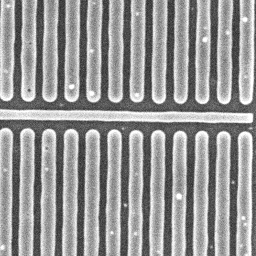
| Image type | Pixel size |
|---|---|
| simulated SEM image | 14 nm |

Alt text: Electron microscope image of groups of lines, slits or small figures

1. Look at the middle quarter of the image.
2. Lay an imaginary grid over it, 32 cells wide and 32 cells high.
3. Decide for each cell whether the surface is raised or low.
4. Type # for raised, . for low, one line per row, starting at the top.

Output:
###...###..####..###..###...###.
###...###..###...###..###...###.
###...###..###...###..###...###.
###...###..###...###..###...###.
####..###..###...###..###...###.
####..###..###...###..###...###.
###...###..###...###..###...###.
###...###..###...###..###...###.
###...###..###...###..###...###.
.......................##...##..
................................
................................
################################
################################
................................
................................
.#..............................
###...###..###...##...###...##..
###...###..###...###..###...##..
###...###..###...##...###...##..
###...###..###...##...###..###..
###...###..###...##...###..###..
###...###..###...###..###..###..
###..####..###...###..###..###..
###..####..###...##...###..###..
###..####..###...##...###..###..
###..####..###...##...###..###..
###..####..###...##...###..###..
###..####..###...##...###..###..
###..####..###...###..###..###..
###..####..###..####..###..###..
###..####..###..###...###..###..